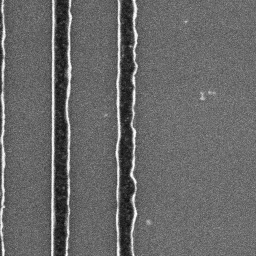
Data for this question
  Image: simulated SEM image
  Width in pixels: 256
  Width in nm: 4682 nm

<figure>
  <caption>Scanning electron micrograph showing one or a few lines or trenches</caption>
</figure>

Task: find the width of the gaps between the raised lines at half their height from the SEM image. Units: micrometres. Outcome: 0.908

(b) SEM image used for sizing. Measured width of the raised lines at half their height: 290 nanometres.